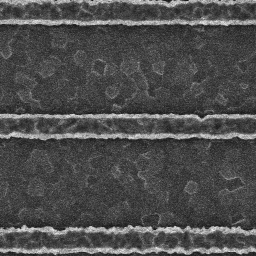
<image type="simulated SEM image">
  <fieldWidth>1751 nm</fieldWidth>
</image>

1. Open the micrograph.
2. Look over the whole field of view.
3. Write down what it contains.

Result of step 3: one or a few lines or trenches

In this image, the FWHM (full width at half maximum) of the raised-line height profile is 0.143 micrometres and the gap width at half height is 640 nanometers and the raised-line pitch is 782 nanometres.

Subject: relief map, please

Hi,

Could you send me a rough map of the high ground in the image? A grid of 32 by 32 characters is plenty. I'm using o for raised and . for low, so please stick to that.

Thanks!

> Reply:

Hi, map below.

oooooooooooooooooooooooooooooooo
oooooooooooooooooooooooooooooooo
oooooooooooooooooooooooooooooooo
................................
................................
................................
................................
................................
................................
................................
................................
................................
................................
................................
oooooo..oooo.ooooooooo.oo.....o.
oooooooooooooooooooooooooooooooo
oooooooooooooooooooooooooooooooo
................................
................................
................................
................................
................................
................................
................................
................................
................................
................................
................................
................o...............
oooooooooooooooooooooooooooooooo
oooooooooooooooooooooooooooooooo
.......................o.....o..